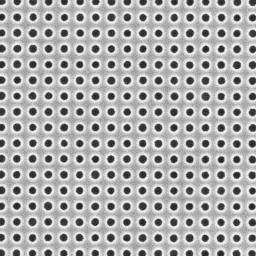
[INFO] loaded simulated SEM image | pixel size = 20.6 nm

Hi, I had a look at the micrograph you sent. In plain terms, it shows a regular array of holes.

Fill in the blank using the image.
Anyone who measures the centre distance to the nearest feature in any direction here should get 317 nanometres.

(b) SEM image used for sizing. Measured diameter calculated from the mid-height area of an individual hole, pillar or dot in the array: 0.172 um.